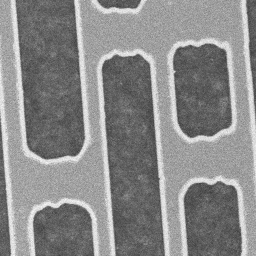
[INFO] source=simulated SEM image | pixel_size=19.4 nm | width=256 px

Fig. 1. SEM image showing one or a few lines or trenches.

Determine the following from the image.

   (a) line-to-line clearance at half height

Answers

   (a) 59.3 px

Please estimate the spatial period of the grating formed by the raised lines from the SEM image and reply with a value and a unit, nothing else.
1470 nm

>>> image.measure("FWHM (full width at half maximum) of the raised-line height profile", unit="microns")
0.36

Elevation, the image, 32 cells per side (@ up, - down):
@@--------@@------@@@@@@@@@@@@--
@@--------@@@@@@@@@@@@@@@@@@@@@-
@@--------@@@@@@@@@@@@@@@@@@@@@-
@@--------@@@@@@@@@@@@@@@@@@@@@-
@@--------@@@@@@@@@@@@@@@@@@@@@-
@@--------@@@@@@@@@@@@@----@@@@-
@@--------@@@@@@@@@@@@-------@@-
@@--------@@@------@@--------@@-
@@--------@@-------@@--------@@-
@@--------@@-------@@--------@@-
@@--------@@@------@@--------@@-
@@---------@@------@@@-------@@-
@@@--------@@------@@@-------@@-
@@@--------@@-------@@-------@@-
@@@--------@@-------@@-------@@@
-@@--------@@-------@@-------@@@
-@@--------@@-------@@------@@@@
-@@--------@@-------@@@@@@@@@@@@
-@@--------@@-------@@@@@@@@@@@@
-@@@------@@@-------@@@@@@@@@@@@
-@@@@@@@@@@@@-------@@@@@@@@@@@@
-@@@@@@@@@@@@-------@@@@@@@@@@@@
-@@@@@@@@@@@@-------@@@@@@@-@@@@
-@@@@@@@@@@@@-------@@@-------@@
-@@@@@@@@@@@@-------@@@-------@@
-@@@@@@---@@@@------@@@-------@@
-@@@-------@@@-------@@-------@@
-@@@--------@@-------@@-------@@
--@@--------@@-------@@-------@@
--@@--------@@-------@@--------@
--@@--------@@-------@@--------@
--@@--------@@-------@@--------@